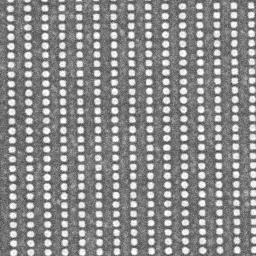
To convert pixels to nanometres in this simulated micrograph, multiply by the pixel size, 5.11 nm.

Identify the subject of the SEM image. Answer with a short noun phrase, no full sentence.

a regular array of raised bodies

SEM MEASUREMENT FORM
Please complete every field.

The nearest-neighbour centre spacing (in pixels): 9.1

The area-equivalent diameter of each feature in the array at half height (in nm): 29.4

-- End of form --